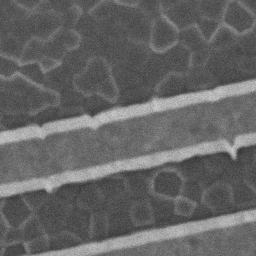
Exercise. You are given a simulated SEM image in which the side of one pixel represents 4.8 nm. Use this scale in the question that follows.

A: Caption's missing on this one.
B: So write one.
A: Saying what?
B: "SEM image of one or a few lines or trenches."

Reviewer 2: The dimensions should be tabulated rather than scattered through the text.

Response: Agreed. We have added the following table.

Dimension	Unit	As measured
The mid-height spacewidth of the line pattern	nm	356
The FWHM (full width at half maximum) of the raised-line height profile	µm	0.249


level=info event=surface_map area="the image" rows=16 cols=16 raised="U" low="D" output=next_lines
DDDDDDDDDDDDDDDD
DDDDDDDDDDDDDDDD
DDDDDDDDDDDDDDDD
DDDDDDDDDDDDDDDD
DDDDDDDDDDDDDDDD
DDDDDDDDDDDDDDDU
DDDDDDDDDDUUUUUU
DDDDDDUUUUUUUUUU
DUUUUUUUUUUUUUUU
UUUUUUUUUUUUDDDD
UUUUUUUDDDDDDDDD
UUUDDDDDDDDDDDDD
DDDDDDDDDDDDDDDD
DDDDDDDDDDDDDDDU
DDDDDDDDDDDUUUUU
DDDDDDUUUUUUUUUU